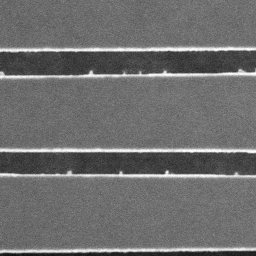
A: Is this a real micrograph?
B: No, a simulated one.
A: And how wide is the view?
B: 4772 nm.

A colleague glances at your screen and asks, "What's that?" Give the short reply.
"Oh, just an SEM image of lines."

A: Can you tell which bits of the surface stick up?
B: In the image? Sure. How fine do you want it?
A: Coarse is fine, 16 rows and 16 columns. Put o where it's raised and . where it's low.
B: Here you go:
oooooooooooooooo
oooooooooooooooo
oooooooooooooooo
................
................
oooooooooooooooo
oooooooooooooooo
oooooooooooooooo
oooooooooooooooo
...............o
................
oooooooooooooooo
oooooooooooooooo
oooooooooooooooo
oooooooooooooooo
oooooooooooooooo